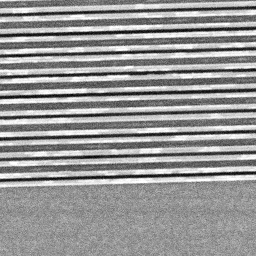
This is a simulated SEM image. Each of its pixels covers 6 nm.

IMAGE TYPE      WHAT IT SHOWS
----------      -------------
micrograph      parallel lines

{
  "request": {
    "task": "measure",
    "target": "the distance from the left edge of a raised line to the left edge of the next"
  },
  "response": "61.2 nanometers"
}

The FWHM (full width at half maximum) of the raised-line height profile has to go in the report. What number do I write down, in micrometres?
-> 0.0277